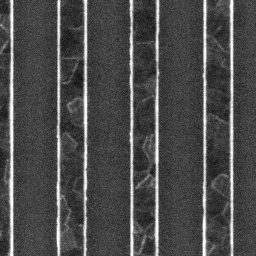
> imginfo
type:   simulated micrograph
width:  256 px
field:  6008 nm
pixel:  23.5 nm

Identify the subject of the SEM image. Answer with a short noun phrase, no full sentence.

lines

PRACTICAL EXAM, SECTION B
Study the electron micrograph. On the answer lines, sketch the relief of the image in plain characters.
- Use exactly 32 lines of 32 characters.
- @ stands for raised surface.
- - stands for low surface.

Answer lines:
@@-----@@@@-----@@@@------@@@---
@@-----@@@@-----@@@@------@@@---
@@-----@@@@-----@@@@------@@@---
@@-----@@@@-----@@@@------@@@---
@@-----@@@@-----@@@@------@@@---
@@-----@@@@-----@@@@------@@@---
@@-----@@@@-----@@@@------@@@---
@@-----@@@@-----@@@@------@@@---
@@-----@@@@-----@@@@------@@@---
@------@@@@-----@@@@------@@@---
@@-----@@@@-----@@@@------@@@---
@------@@@@-----@@@@------@@@---
@------@@@@-----@@@@------@@@---
@------@@@@-----@@@@------@@@---
@------@@@@-----@@@@------@@@---
@------@@@@-----@@@@------@@@---
@------@@@@-----@@@@------@@@---
@@-----@@@@-----@@@@------@@@---
@@-----@@@@-----@@@@------@@@---
@@-----@@@@-----@@@@------@@@---
@@-----@@@@-----@@@@------@@@---
@------@@@@-----@@@@------@@@---
@------@@@@-----@@@@------@@@---
@------@@@@-----@@@@------@@@---
@------@@@@-----@@@@------@@@---
@------@@@@-----@@@@------@@@---
@@-----@@@@-----@@@@------@@@---
@@-----@@@@-----@@@@------@@@---
@@-----@@@@-----@@@@------@@@---
@@-----@@@@-----@@@@-----@@@@---
@@-----@@@@-----@@@@------@@@---
@@-----@@@@-----@@@@------@@@---